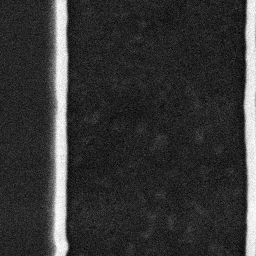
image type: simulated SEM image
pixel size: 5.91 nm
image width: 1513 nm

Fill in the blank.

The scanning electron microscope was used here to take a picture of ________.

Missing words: one or a few lines or trenches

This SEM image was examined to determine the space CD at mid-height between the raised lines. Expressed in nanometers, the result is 1130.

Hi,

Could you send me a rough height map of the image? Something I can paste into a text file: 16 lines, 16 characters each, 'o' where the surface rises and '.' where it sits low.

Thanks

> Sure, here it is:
oooo............
oooo............
oooo............
oooo............
oooo............
oooo............
oooo............
oooo............
oooo............
oooo............
oooo............
oooo............
oooo............
oooo............
oooo............
oooo............